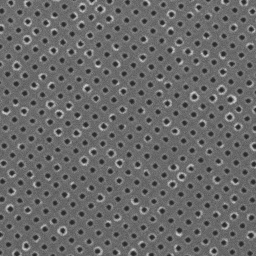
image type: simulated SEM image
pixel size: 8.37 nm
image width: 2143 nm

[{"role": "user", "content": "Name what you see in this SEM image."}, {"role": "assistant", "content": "a regular array of holes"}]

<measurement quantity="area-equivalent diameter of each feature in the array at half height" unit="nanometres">44.8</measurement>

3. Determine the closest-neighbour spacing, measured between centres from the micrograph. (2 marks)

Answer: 103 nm